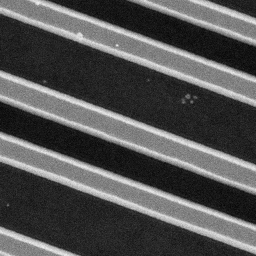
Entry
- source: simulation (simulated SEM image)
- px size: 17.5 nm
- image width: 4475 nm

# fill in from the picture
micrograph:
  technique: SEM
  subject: lines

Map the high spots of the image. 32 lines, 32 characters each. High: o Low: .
ooooooo...........ooooooooo.....
oooooooooo...........oooooooo...
...ooooooooo...........ooooooooo
......ooooooooo...........oooooo
.........ooooooooo...........ooo
...........oooooooooo...........
..............ooooooooo.........
.................ooooooooo......
...................oooooooooo...
oo....................oooooooooo
oooo.....................ooooooo
ooooooo.....................oooo
oooooooooo....................oo
...ooooooooo....................
......ooooooooo.................
........oooooooooo..............
...........oooooooooo...........
ooo...........ooooooooo.........
ooooo............ooooooooo......
oooooooo...........oooooooooo...
..ooooooooo...........ooooooooo.
....oooooooooo...........ooooooo
.......ooooooooo...........ooooo
..........ooooooooo...........oo
.............ooooooooo..........
...............ooooooooo........
..................ooooooooo.....
.....................ooooooooo..
........................oooooooo
ooo........................ooooo
ooooo........................ooo
oooooooo........................